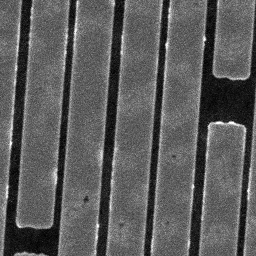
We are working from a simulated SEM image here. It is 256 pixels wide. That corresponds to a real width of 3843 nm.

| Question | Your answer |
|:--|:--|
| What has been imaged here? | parallel lines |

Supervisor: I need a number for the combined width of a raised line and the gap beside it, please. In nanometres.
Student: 694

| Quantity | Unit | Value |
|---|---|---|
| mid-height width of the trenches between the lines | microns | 0.15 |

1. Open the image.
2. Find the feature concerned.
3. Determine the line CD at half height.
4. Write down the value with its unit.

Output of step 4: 556 nm